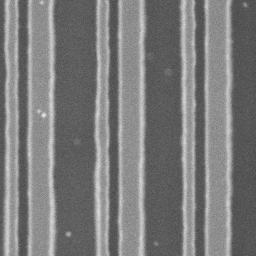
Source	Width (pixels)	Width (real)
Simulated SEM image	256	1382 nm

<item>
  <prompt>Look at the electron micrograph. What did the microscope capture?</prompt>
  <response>lines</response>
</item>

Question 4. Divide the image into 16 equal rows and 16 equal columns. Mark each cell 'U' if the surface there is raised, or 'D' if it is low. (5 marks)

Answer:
UUUDDDUUUDDDUUDD
UUUDDDUUUDDDUUDD
UUUDDDUUUDDDUUDD
UUUDDDUUUDDDUUDD
UUUDDDUUUDDDUUDD
UUUDDDUUUDDDUUDD
UUUDDDUUUDDDUUDD
UUUDDDUUUDDDUUDD
UUUDDDUUUDDDUUDD
UUUDDDUUUDDDUUDD
UUUDDDUUUDDDUUDD
DUUDDDUUUDDDUUDD
UUUDDDUUUDDDUUDD
UUUDDDUUUDDDUUDD
UUUDDDUUUDDDUUDD
UUUDDDUUUDDDUUDD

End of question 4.